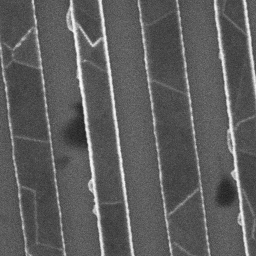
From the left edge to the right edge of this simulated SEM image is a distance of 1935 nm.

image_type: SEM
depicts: lines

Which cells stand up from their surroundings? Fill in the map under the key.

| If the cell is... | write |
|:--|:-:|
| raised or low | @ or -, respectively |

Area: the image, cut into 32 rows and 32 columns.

@@@@-----@@@@----@@@@@-----@@@@-
@@@@-----@@@@----@@@@@-----@@@@-
@@@@-----@@@@-----@@@@-----@@@@-
@@@@@----@@@@-----@@@@@----@@@@-
@@@@@----@@@@-----@@@@@----@@@@-
@@@@@----@@@@-----@@@@@----@@@@-
@@@@@-----@@@-----@@@@@-----@@@-
@@@@@-----@@@@----@@@@@-----@@@@
@@@@@-----@@@@----@@@@@-----@@@@
@@@@@-----@@@@----@@@@@-----@@@@
-@@@@-----@@@@-----@@@@@----@@@@
-@@@@@----@@@@-----@@@@@----@@@@
-@@@@@----@@@@-----@@@@@----@@@@
-@@@@@-----@@@-----@@@@@-----@@@
-@@@@@-----@@@-----@@@@@-----@@@
-@@@@@-----@@@@----@@@@@-----@@@
-@@@@@-----@@@@----@@@@@-----@@@
-@@@@@-----@@@@-----@@@@-----@@@
--@@@@-----@@@@-----@@@@-----@@@
--@@@@@----@@@@-----@@@@@----@@@
--@@@@@----@@@@-----@@@@@----@@@
--@@@@@-----@@@-----@@@@@-----@@
--@@@@@-----@@@-----@@@@@-----@@
--@@@@@-----@@@@----@@@@@-----@@
--@@@@@-----@@@@----@@@@@-----@@
---@@@@-----@@@@-----@@@@-----@@
---@@@@@----@@@@-----@@@@@----@@
---@@@@@----@@@@-----@@@@@----@@
---@@@@@----@@@@-----@@@@@----@@
---@@@@@-----@@@-----@@@@@-----@
---@@@@@-----@@@-----@@@@@-----@
---@@@@@-----@@@@----@@@@@-----@